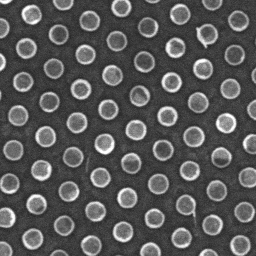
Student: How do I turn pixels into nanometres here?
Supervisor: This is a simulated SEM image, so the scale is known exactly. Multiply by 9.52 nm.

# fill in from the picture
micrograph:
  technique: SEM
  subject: a regular array of raised bodies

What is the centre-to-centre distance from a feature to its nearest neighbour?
321 nanometers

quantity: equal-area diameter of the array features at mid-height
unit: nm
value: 181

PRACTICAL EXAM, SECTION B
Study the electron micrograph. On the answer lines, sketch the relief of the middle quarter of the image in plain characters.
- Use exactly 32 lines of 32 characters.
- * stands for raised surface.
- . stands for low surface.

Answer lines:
...........*......****..........
..........****.....**...........
..........****............**....
..........****...........****...
...***.....***...........****...
..****...................****...
..*****..........****.....**....
..****...........****...........
...**............****..........*
..........**.....****..........*
.........****..................*
.........****...........***.....
..**.....****...........****....
.****.....**............****....
.*****...........**.....****....
.*****..........****............
..***...........****...........*
................****..........**
........****.....**...........**
........****............**....**
........****...........****.....
.***....****...........****.....
****...................****.....
*****..........****.....**......
****...........****.............
..*............****...........**
........**.....***...........***
.......****..................***
.......****...........***.....**
.......****..........*****......
***.....**...........*****......
***............**.....****......